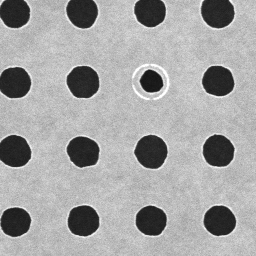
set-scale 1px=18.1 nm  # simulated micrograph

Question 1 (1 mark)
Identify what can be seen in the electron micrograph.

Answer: a regular array of holes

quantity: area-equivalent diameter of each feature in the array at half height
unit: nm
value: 579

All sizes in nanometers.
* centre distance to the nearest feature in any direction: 1230